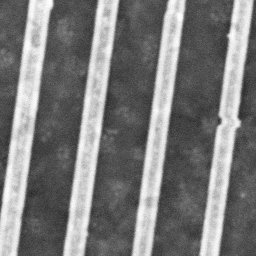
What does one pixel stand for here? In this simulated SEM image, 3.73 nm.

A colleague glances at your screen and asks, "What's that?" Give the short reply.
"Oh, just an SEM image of one or a few lines or trenches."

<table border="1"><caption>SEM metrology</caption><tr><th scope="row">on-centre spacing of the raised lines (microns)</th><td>0.25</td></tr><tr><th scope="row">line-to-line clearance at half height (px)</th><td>53.4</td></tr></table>